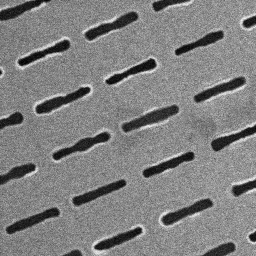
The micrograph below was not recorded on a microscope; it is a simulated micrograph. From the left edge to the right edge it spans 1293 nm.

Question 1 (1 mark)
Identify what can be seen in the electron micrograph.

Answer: a regular array of holes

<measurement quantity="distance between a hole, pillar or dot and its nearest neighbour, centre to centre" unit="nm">256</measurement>